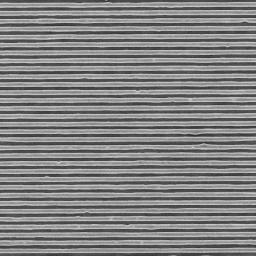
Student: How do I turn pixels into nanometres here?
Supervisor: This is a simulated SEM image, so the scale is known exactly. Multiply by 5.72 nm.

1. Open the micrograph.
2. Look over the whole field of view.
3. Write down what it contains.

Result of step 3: parallel lines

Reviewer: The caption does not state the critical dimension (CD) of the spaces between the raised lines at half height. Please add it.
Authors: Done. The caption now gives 21.5 nanometres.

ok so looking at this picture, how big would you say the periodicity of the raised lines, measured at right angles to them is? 45.3 nm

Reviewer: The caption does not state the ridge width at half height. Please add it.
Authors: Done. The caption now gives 26.5 nanometres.